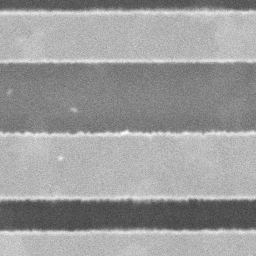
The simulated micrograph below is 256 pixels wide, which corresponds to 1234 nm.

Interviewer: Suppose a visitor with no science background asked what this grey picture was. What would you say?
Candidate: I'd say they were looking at lines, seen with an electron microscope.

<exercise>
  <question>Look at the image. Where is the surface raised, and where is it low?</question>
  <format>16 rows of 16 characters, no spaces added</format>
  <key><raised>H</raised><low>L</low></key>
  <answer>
LLLLLLLLLLLLLLLL
HHHHHHHHHHHHHHHH
HHHHHHHHHHHHHHHH
HHHHHHHHHHHHHHHH
LLLLLLLLLLLLLLLL
LLLLLLLLLLLLLLLL
LLLLLLLLLLLLLLLL
LLLLLLLLLLLLLLLL
HHHHHHHHHHHHHHHH
HHHHHHHHHHHHHHHH
HHHHHHHHHHHHHHHH
HHHHHHHHHHHHHHHH
LLLLLLLLLLLLLLLL
LLLLLLLLLLLLLLLL
HHHHHHHHHHHHHHHH
HHHHHHHHHHHHHHHH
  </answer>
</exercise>